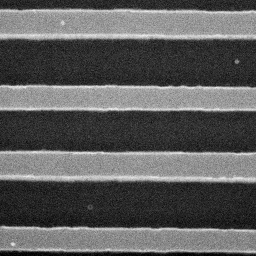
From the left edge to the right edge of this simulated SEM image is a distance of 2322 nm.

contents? lines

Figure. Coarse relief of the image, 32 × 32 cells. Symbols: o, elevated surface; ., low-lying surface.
................................
oooooooooooooooooooooooooo.o...o
oooooooooooooooooooooooooooooooo
oooooooooooooooooooooooooooooooo
................................
................................
................................
................................
................................
................................
................................
oooooooooooooooooooooooooooooooo
oooooooooooooooooooooooooooooooo
oooooooooooooooooooooooooooooooo
................................
................................
................................
................................
................................
oooooooooooooooooooooooooooooooo
oooooooooooooooooooooooooooooooo
oooooooooooooooooooooooooooooooo
................................
................................
................................
................................
................................
................................
ooo.............................
oooooooooooooooooooooooooooooooo
oooooooooooooooooooooooooooooooo
..............................oo